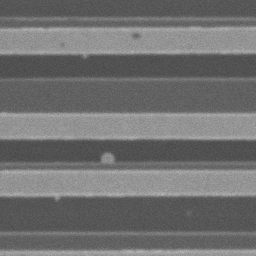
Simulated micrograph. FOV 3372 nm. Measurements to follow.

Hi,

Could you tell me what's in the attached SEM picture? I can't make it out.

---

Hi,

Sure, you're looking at lines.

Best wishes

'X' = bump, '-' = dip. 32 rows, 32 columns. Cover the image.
--------------------------------
--------------------------------
XXXXXXXXXXXXXXXXXXXXXXXXXXXXXXXX
XXXXXXXXXXXXXXXXXXXXXXXXXXXXXXXX
XXXXXXXXXXXXXXXXXXXXXXXXXXXXXXXX
XXXXXXXXXXXXXXXXXXXXXXXXXXXXXXXX
XXXXXXXXXXXXXXXXXXXXXXXXXXXXXXXX
--------------------------------
--------------------------------
--------------------------------
XXXXXXXXXXXXXXXXXXXXXXXXXXXXXXXX
XXXXXXXXXXXXXXXXXXXXXXXXXXXXXXXX
XXXXXXXXXXXXXXXXXXXXXXXXXXXXXXXX
XXXXXXXXXXXXXXXXXXXXXXXXXXXXXXXX
XXXXXXXXXXXXXXXXXXXXXXXXXXXXXXXX
XXXXXXXXXXXXXXXXXXXXXXXXXXXXXXXX
XXXXXXXXXXXXXXXXXXXXXXXXXXXXXXXX
--------------------------------
--------------------------------
--------------------------------
------XX-XXXXXXXXXXXXXXXXXXXXXXX
XXXXXXXXXXXXXXXXXXXXXXXXXXXXXXXX
XXXXXXXXXXXXXXXXXXXXXXXXXXXXXXXX
XXXXXXXXXXXXXXXXXXXXXXXXXXXXXXXX
--------------------------------
--------------------------------
--------------------------------
--------------------------------
--------------------------------
XXXXXXXXXXXXXXXXXXXXXXXXXXXXXXXX
XXXXXXXXXXXXXXXXXXXXXXXXXXXXXXXX
XXXXXXXXXXXXXXXXXXXXXXXXXXXXXXXX